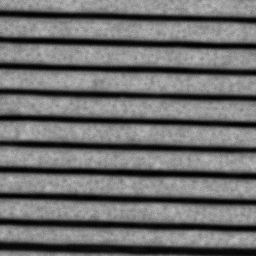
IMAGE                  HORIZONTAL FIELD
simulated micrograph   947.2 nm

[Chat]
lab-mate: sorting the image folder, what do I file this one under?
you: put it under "parallel lines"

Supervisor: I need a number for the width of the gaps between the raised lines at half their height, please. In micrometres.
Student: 0.0273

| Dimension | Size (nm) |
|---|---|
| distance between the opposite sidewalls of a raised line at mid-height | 68.5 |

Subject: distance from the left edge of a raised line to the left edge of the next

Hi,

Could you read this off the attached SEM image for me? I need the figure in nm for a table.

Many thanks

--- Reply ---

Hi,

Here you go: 95.6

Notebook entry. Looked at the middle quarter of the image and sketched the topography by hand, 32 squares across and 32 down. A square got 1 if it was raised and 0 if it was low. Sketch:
00000000000000000000000001111111
00000000000000000000000000000000
11111111111111111111110000000000
11111111111111111111111111111111
11111111111111111111111111111111
11111111111111111111111111111111
01111000111111111111111111111111
00000000000000000000000000000000
00000000000000000000000000000000
11111111111111111111111111111111
11111111111111111111111111111111
11111111111111111111111111111111
11111111111111111111111111111111
00000000000000000000000000001111
00000000000000000000000000000000
11111111111111111111111110111100
11111111111111111111111111111111
11111111111111111111111111111111
11111111111111111111111111111111
00000011111111111111111111111111
00000000000000000000000000000000
11111110000000000000000000000000
11111111111111111111111111111111
11111111111111111111111111111111
11111111111111111111111111111111
11111111111111111111111111111111
00000000000000000000000000000011
00000000000000000000000000000000
11111111111111111110001111100000
11111111111111111111111111111111
11111111111111111111111111111111
11111111111111111111111111111111